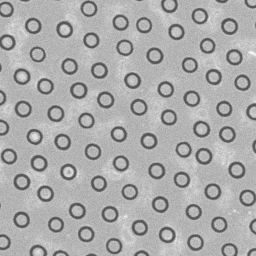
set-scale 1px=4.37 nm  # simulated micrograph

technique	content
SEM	a regular array of ring-shaped grooves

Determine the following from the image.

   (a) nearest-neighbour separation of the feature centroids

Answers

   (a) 0.123 µm